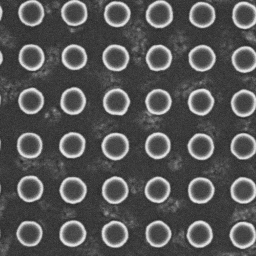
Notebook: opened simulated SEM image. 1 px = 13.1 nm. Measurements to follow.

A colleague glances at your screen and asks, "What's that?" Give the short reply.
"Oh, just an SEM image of a regular array of raised bodies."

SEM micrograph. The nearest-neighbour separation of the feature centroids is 554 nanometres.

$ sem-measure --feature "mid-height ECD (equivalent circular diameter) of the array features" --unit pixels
24.8